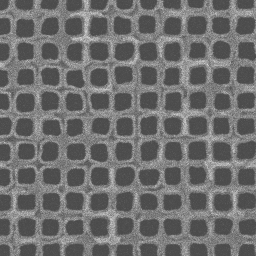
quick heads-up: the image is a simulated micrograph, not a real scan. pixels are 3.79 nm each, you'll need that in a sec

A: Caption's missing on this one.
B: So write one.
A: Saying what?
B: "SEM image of a regular array of holes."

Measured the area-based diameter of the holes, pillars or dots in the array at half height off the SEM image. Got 70.7 nanometres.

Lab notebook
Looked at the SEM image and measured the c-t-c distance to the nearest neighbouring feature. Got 0.0899 µm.